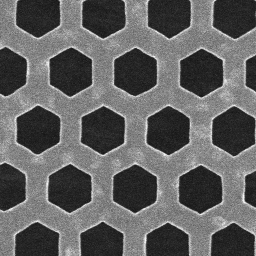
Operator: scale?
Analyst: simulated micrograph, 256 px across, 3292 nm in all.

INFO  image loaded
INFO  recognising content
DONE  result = a regular array of holes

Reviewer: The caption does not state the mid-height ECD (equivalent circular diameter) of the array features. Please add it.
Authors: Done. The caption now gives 45.4 pixels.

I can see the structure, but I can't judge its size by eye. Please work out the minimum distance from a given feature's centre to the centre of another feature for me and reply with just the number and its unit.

836 nm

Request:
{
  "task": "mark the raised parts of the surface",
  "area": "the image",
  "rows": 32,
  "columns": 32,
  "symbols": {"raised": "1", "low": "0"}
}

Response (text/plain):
11000001110000001110000011100000
11000001110000001100000011100000
11000000110000001100000011000000
11000001111000011110000111100000
11110111111101111111101111111011
11111111111111111111111111111111
00111111001111110011111100111111
00011100000111000001111000001110
00011100000111000000111000001110
00011100000011000000111000001110
00011100000111000000111000001110
00111111001111110011111100111111
11111111111111111111111111111111
11110111111101111111001111111011
11000001111000011110000111100001
11000000110000001100000011100000
11000000110000001100000011000000
11000001110000011100000011100000
11100011111000111110000111100001
11111111111111111111111111111111
01111111111111111111111111111111
00011110001111100001111000011111
00011100000111000000110000001110
00011100000011000000110000001110
00011100000111000000110000001110
00111110000111100001111000011110
11111111011111111111111100111111
11111111111111111111111111111111
11100011111000111111001111110011
11000001110000011100000111100000
11000001110000001100000011000000
11000001110000011100000011000000